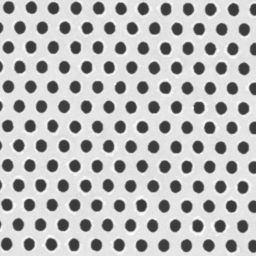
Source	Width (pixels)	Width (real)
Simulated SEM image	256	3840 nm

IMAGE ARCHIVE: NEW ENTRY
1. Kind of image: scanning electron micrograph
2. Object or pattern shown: a regular array of holes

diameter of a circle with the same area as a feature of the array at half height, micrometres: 0.184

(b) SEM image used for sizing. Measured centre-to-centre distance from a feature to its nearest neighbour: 334 nm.